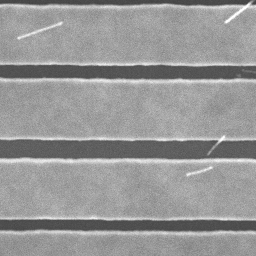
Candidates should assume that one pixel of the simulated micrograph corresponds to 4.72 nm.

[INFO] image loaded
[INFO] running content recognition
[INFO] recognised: lines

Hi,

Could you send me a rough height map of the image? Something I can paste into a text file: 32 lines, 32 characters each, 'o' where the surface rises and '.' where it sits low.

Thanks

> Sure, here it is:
...............................o
oooooooooooooooooooooooooooooooo
oooooooooooooooooooooooooooooooo
oooooooooooooooooooooooooooooooo
oooooooooooooooooooooooooooooooo
oooooooooooooooooooooooooooooooo
oooooooooooooooooooooooooooooooo
oooooooooooooooooooooooooooooooo
................................
................................
oooooooooooooooooooooooooooooooo
oooooooooooooooooooooooooooooooo
oooooooooooooooooooooooooooooooo
oooooooooooooooooooooooooooooooo
oooooooooooooooooooooooooooooooo
oooooooooooooooooooooooooooooooo
oooooooooooooooooooooooooooooooo
................o..oooo....ooo..
................................
................................
oooooooooooooooooooooooooooooooo
oooooooooooooooooooooooooooooooo
oooooooooooooooooooooooooooooooo
oooooooooooooooooooooooooooooooo
oooooooooooooooooooooooooooooooo
oooooooooooooooooooooooooooooooo
oooooooooooooooooooooooooooooooo
................................
................................
oooooooooooooooooooooooooooooooo
oooooooooooooooooooooooooooooooo
oooooooooooooooooooooooooooooooo